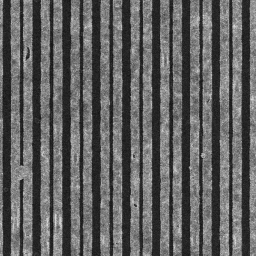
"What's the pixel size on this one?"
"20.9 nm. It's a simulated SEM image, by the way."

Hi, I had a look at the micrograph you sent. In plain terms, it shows parallel lines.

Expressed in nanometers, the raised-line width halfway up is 173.